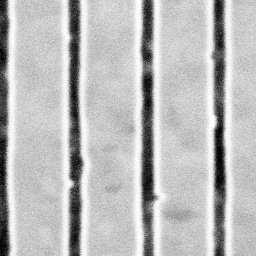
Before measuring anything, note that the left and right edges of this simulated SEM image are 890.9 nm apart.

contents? one or a few lines or trenches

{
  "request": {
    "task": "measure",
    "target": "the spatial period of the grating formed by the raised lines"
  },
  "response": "252 nanometres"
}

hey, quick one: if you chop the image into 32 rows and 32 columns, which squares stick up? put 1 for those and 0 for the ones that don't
01111111001111111000111111001111
01111111001111111000111111001111
01111111001111111000111111001111
01111111001111111000111111001111
01111111001111111001111111001111
01111111001111111001111111001111
01111111001111111001111111000111
01111111001111111001111111000111
01111111001111111101111111000111
01111111001111111001111111001111
01111111001111111001111111001111
01111111001111111001111111001111
01111111001111111001111111001111
01111111001111111000111111001111
01111111001111111001111111101111
01111111001111111001111111101111
01111111001111111000111111001111
01111111001111111000111111001111
01111111001111111000111111001111
01111111001111111000111111001111
01111111000111111001111111001111
01111111000111111000111111001111
01111111001111111000111111000111
01111111101111111000111111000111
01111111001111111000111111000111
01111111000111111001111111001111
01111111001111111001111111001111
01111111001111111000111111001111
01111111001111111000111111001111
01111111001111111100111111000111
00111111001111111000111111000111
01111111001111111000111111000111